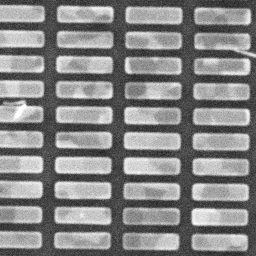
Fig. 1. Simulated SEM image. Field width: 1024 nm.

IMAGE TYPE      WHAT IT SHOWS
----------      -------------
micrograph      groups of lines, slits or small figures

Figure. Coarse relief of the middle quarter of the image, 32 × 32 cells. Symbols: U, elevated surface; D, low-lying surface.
UUUUUUUUUUUUDDDDUUUUUUUUUUUUUDDD
UUUUUUUUUUUUDDDDUUUUUUUUUUUUUDDD
DDDDDDDDDDDDDDDDDDDDDDDDDDDDDDDD
DDDDDDDDDDDDDDDDDDDDDDDDDDDDDDDD
DDDDDDDDDDDDDDDDDDDDDDDDDDDDDDDD
UUUUUUUUUUUUDDDUUUUUUUUUUUUUUDDD
UUUUUUUUUUUUDDDUUUUUUUUUUUUUUDDD
UUUUUUUUUUUUDDDUUUUUUUUUUUUUUDDD
DDDDDDDDDDDDDDDDDDDDDDDDDDUUUDDD
DDDDDDDDDDDDDDDDDDDDDDDDDDDDDDDD
DDDDDDDDDDDDDDDDDDDDDDDDDDDDDDDD
UUUUUUUUUUUUDDDUUUUUUUUUUUUUUDDD
UUUUUUUUUUUUDDDUUUUUUUUUUUUUUDDD
UUUUUUUUUUUUDDDUUUUUUUUUUUUUUDDD
UUUUUUUUUUUUDDDUUUUUUUUUUUUUUDDD
DDDDDDDDDDDDDDDDDDDDDDDDDDDDDDDD
DDDDDDDDDDDDDDDDDDDDDDDDDDDDDDDD
UUUUUUUUUUUUDDDDUUUUUUUUUUUUDDDD
UUUUUUUUUUUUDDDUUUUUUUUUUUUUUDDD
UUUUUUUUUUUUDDDUUUUUUUUUUUUUUDDD
UUUUUUUUUUUUDDDUUUUUUUUUUUUUUDDD
DDDDDDDDDDDDDDDDDDDDDDDDDDDDDDDD
DDDDDDDDDDDDDDDDDDDDDDDDDDDDDDDD
UDDUUUUUUUDDDDDDDDDDDDDDDDDDDDDD
UUUUUUUUUUUDDDDUUUUUUUUUUUUUUDDD
UUUUUUUUUUUDDDDUUUUUUUUUUUUUUDDD
UUUUUUUUUUUDDDDUUUUUUUUUUUUUUDDD
DDDDDDDDDDDDDDDDDDDDDDDDDDDDDDDD
DDDDDDDDDDDDDDDDDDDDDDDDDDDDDDDD
DDDDDDDDDDDDDDDDDDDDDDDDDDDDDDDD
UUUUUUUUUUUDDDDUUUUUUUUUUUUUUDDD
UUUUUUUUUUUDDDDUUUUUUUUUUUUUUDDD